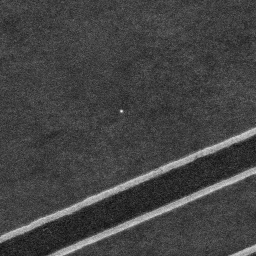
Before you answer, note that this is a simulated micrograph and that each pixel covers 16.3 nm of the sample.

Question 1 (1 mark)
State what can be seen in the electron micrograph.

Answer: one or a few lines or trenches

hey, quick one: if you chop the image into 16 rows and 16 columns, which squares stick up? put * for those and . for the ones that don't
****************
****************
****************
****************
****************
****************
****************
****************
***************.
*************...
**********......
********......**
******......****
***......*******
*......*********
.....***********